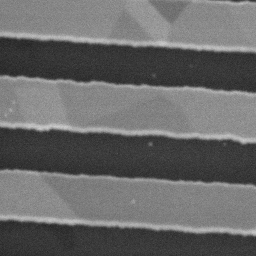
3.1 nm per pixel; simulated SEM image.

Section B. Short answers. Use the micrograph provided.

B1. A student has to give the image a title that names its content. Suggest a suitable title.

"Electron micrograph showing lines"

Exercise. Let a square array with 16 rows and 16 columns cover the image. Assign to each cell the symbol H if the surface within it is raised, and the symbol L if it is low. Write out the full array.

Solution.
HHHHHHHHHHHHHHHH
HHHHHHHHHHHHHHHH
LLLLHHHHHHHHHHHH
LLLLLLLLLLLLLLLL
LLLLLLLLLLLLLLLL
HHHHHHHHHHHHHLLL
HHHHHHHHHHHHHHHH
HHHHHHHHHHHHHHHH
LLLLLLLLLLLHHHHH
LLLLLLLLLLLLLLLL
LLLLLLLLLLLLLLLL
HHHHHHHHHHHHHHHL
HHHHHHHHHHHHHHHH
HHHHHHHHHHHHHHHH
LLLLLLLLLLLLLLHH
LLLLLLLLLLLLLLLL